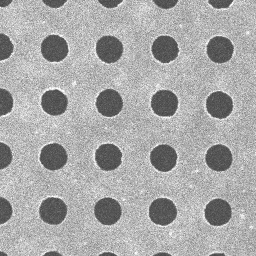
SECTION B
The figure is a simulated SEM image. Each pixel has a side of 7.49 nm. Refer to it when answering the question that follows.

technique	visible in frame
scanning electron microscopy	a regular array of holes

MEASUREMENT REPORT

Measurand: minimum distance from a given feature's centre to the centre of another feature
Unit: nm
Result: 404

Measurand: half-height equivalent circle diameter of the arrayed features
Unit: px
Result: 27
